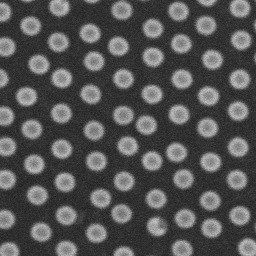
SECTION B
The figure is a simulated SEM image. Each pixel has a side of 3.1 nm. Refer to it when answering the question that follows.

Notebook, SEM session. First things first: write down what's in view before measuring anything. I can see a regular array of raised bodies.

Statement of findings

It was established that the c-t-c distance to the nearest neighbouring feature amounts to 0.0952 microns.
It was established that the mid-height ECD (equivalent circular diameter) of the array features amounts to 57.7 nanometres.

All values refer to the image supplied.